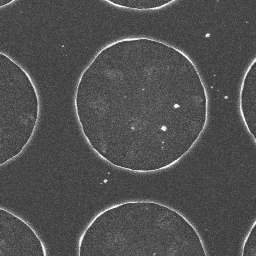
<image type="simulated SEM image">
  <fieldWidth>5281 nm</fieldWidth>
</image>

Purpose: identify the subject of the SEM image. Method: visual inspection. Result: holes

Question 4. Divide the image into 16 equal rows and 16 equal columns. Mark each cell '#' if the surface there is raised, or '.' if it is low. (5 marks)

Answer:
########..######
################
########.#######
######.....#####
..###.......####
..###........##.
..###........##.
..###........##.
..###.......####
.#####......####
########..######
################
################
.#####.....#####
..###.......####
...##........##.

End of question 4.